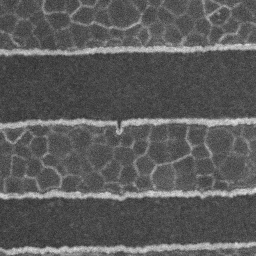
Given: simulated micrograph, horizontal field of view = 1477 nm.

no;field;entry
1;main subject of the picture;one or a few lines or trenches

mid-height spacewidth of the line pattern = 61.1 px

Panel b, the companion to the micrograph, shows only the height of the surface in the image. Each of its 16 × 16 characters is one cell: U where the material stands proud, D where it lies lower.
UUUUUUUUUUUUUUUU
UUUUUUUUUUUUUUUU
UUUUUUUUUUUUUUUU
DDDDDDDDDDDDDDDD
DDDDDDDDDDDDDDDD
DDDDDDDDDDDDDDDD
DDDDDDDDDDDDDDDD
DDDDDDDDDDDDDDDU
UUUUUUUUUUUUUUUU
UUUUUUUUUUUUUUUU
UUUUUUUUUUUUUUUU
UUUUUUUUUUUUUUUU
DDDDDDDDDDDDDDDD
DDDDDDDDDDDDDDDD
DDDDDDDDDDDDDDDD
DDDDDDDDDUUUUUUU